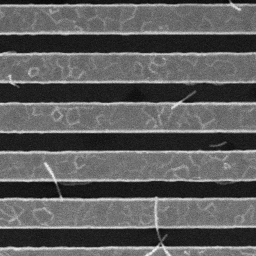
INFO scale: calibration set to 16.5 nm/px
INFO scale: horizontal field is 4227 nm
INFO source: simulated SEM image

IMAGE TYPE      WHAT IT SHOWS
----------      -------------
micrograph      lines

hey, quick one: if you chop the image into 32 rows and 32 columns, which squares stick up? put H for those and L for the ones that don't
LLLLLLLLLLLLLLLLLLLLLLLLLLLLHLLL
HHHHHHHHHHHHHHHHHHHHHHHHHHHHHHHH
HHHHHHHHHHHHHHHHHHHHHHHHHHHHHHHH
HHHHHHHHHHHHHHHHHHHHHHHHHHHHHHHH
LLLLLLLLLLLLLLLLLLLLLLLLLLLLLLLL
LLLLLLLLLLLLLLLLLLLLLLLLLLLLLLLL
LLLLLLLLLLLLLLLLLLLLLLLLLLLLLLLL
HHHHHHHHHHHHHHHHHHHHHHHHHHHHHHHH
HHHHHHHHHHHHHHHHHHHHHHHHHHHHHHHH
HHHHHHHHHHHHHHHHHHHHHHHHHHHHHHHH
LHLLLLLLLLLLLLLLLLLLLLLLLLLLLLLL
LLLLLLLLLLLLLLLLLLLLLLLLLLLLLLLL
LLLLLLLLLLLLLLLLLLLLLLLLLLLLLLLL
HHHHHHHHHHHHHHHHHHHHHHHHHHHHHHHH
HHHHHHHHHHHHHHHHHHHHHHHHHHHHHHHH
HHHHHHHHHHHHHHHHHHHHHHHHHHHHHHHH
HHHHHHHHHHHHHHHHHHHHHHHHHHHHHHHH
LLLLLLLLLLLLLLLLLLLLLLLLLLLLLLLL
LLLLLLLLLLLLLLLLLLLLLLLLLLLLLLLL
HHHHHHHHHHHHHHHHHHHHHHHHHHHHHHHH
HHHHHHHHHHHHHHHHHHHHHHHHHHHHHHHH
HHHHHHHHHHHHHHHHHHHHHHHHHHHHHHHH
HHHHHHHHHHHHHHHHHHHHHHHHHHHHHHHH
LLLLLLLLLLLLLLLLLLLLLLLLLLLLLLLL
LLLLLLLLLLLLLLLLLLLLLLLLLLLLLLLL
HHHHHHHHHHHHHHHHHHHHHHHHHHHHHHHH
HHHHHHHHHHHHHHHHHHHHHHHHHHHHHHHH
HHHHHHHHHHHHHHHHHHHHHHHHHHHHHHHH
HHHHHHHHHHHHHHHHHHHHHHHLHHHHHLLL
LLLLLLLLLLLLLLLLLLLLLLLLLLLLLLLL
LLLLLLLLLLLLLLLLLLLLLLLLLLLLLLLL
HHHHHHHHHHHHHHHHHHHHHHHHHHHHHHHH